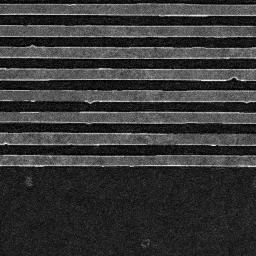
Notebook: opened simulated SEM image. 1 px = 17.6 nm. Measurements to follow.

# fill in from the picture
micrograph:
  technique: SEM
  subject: parallel lines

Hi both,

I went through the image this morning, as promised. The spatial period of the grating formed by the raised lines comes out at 381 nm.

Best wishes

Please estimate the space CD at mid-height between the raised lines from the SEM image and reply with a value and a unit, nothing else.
196 nanometers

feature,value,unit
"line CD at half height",10.2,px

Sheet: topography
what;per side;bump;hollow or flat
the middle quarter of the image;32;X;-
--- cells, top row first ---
--------------------------------
XXXXXXXXXXXXXXXXXXXXXXXXXXXXXXXX
XXXXXXXXXXXXXXXXXXXXXXXXXXXXXXXX
XXXXXXXXXXXXXXXXXXXXXXXXXXXXXXXX
--------------------------------
--------------------------------
--------------------------------
XXXXXXXXXXXXXXXXXXXXXXXXXXXXXXXX
XXXXXXXXXXXXXXXXXXXXXXXXXXXXXXXX
------X-------------------------
--------------------------------
--------------------------------
XXXXXXXXXXXXXXXXXXXXXXXXXXXXXXXX
XXXXXXXXXXXXXXXXXXXXXXXXXXXXXXXX
-----XXX-XXXXXXXXXXXXXXXXXXXXXXX
--------------------------------
--------------------------------
XXX-----------------------------
XXXXXXXXXXXXXXXXXXXXXXXXXXXXXXXX
XXXXXXXXXXXXXXXXXXXXXXXXXXXXXXXX
--------------------------------
--------------------------------
--------------------------------
XXXXXXXXXXXXXXXXXXXXXXXXXXXXXXXX
XXXXXXXXXXXXXXXXXXXXXXXXXXXXXXXX
--------------------------------
--------------------------------
--------------------------------
--------------------------------
--------------------------------
--------------------------------
--------------------------------